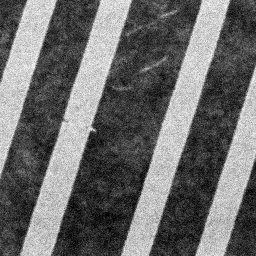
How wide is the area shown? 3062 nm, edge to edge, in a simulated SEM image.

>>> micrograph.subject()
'one or a few lines or trenches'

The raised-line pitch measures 1.04 micrometres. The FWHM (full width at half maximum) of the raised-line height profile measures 316 nm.